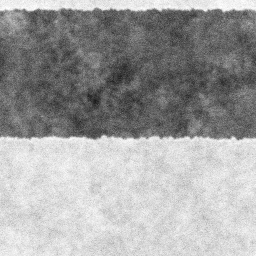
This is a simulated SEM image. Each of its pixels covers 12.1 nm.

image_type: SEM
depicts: one or a few lines or trenches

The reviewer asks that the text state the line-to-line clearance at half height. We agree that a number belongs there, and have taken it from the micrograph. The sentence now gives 1570 nm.